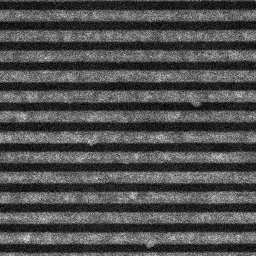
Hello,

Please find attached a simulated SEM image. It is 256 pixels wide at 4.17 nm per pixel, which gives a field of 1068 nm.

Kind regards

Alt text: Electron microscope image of parallel lines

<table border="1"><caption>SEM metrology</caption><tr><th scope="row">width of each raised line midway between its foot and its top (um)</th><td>0.0422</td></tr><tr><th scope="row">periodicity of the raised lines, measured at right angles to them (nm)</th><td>84.4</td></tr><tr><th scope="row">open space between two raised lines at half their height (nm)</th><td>42.2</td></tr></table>